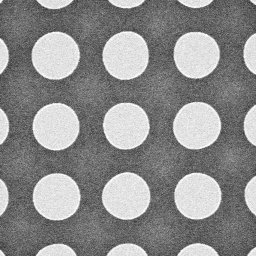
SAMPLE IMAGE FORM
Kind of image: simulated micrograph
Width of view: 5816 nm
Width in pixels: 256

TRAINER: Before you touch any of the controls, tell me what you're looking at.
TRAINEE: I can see an array of small figures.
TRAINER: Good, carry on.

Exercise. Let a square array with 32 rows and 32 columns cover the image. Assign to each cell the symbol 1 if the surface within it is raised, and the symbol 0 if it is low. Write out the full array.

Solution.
00000111100000111000000111000000
00000000000000000000000000000000
00000000000000000000000000000000
00000000000000000000000000000000
00000111100000111000000111000000
10001111100001111100001111100001
10001111110001111100001111100001
10001111110001111100001111100001
10001111100001111100001111100001
00000111000000111000000111000000
00000000000000000000000000000000
00000000000000000000000000000000
00000000000000000000000000000000
00000111100000111000000111100000
10000111110001111100001111100001
10001111110001111110001111100001
10001111110001111100001111100001
10000111100000111100001111100001
00000011000000011000000110000000
00000000000000000000000000000000
00000000000000000000000000000000
00000000000000000000000000000000
00000111100000111100000111100001
10001111110001111100001111100001
10001111110001111110001111110001
10001111110001111110001111100001
00000111100000111100000111100000
00000001000000000000000000000000
00000000000000000000000000000000
00000000000000000000000000000000
00000000000000000000000000000000
00000111100000111100001111100001